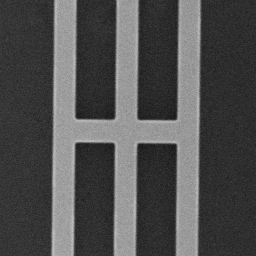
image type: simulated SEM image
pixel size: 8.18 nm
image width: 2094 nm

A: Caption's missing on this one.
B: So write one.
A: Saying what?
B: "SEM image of groups of lines, slits or small figures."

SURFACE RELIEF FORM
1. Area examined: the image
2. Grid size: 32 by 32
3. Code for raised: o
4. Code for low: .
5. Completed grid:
.......oo......oo.....ooo.......
.......oo......oo.....ooo.......
.......oo......oo.....ooo.......
.......oo......oo.....ooo.......
.......oo......oo.....ooo.......
.......oo......oo.....ooo.......
.......oo......oo.....ooo.......
.......oo......oo.....ooo.......
.......oo......oo.....ooo.......
.......oo......oo.....ooo.......
.......oo......oo.....ooo.......
.......oo......oo.....ooo.......
.......oo......oo.....ooo.......
.......oo......oo.....ooo.......
.......oo.....ooo.....ooo.......
.......oooooooooooooooooo.......
.......oooooooooooooooooo.......
.......oooooooooooooooooo.......
.......oo.....ooo.....ooo.......
.......oo.....ooo.....ooo.......
.......oo.....ooo.....ooo.......
.......oo.....ooo.....ooo.......
.......oo.....ooo.....ooo.......
.......oo.....ooo.....ooo.......
.......oo.....ooo.....ooo.......
.......oo.....ooo.....ooo.......
.......oo.....ooo.....ooo.......
.......oo.....ooo.....ooo.......
.......oo.....ooo.....ooo.......
.......oo.....ooo.....ooo.......
.......oo.....ooo.....ooo.......
.......oo.....ooo.....ooo.......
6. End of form